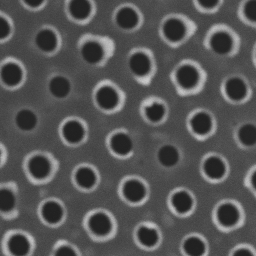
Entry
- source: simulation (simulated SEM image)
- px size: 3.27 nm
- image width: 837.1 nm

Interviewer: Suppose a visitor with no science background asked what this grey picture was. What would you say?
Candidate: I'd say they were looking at a regular array of holes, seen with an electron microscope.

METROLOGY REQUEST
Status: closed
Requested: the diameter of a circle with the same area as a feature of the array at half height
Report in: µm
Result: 0.07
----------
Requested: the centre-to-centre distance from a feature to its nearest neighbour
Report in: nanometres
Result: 154